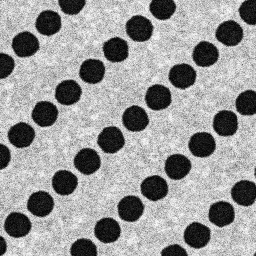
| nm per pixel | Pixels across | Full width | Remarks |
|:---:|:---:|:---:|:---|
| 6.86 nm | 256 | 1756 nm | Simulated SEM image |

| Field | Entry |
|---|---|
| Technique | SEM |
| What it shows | a regular array of holes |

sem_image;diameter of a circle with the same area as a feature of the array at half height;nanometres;184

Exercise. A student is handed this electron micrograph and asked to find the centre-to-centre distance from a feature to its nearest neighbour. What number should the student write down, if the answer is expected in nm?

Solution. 217